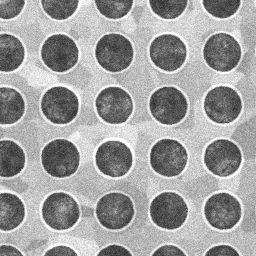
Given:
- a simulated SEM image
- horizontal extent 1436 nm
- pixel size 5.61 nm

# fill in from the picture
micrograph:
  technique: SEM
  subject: a regular array of holes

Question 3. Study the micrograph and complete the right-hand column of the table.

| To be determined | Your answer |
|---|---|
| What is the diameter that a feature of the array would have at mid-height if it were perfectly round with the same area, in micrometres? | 0.222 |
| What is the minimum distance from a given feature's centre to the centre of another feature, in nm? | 295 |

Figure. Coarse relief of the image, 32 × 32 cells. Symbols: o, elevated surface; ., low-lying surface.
...oo.....oo.....oo....oo.....oo
...ooo...ooo....ooo....ooo....oo
ooooooo.oooooooooooooooooooooooo
oooooooooooooooooooooooooooooooo
..oooo...oooo...oooo..oooo...ooo
...oo.....oo.....oo....ooo....oo
...oo.....oo.....oo....oo.....oo
...oo.....oo.....oo....ooo....oo
..oooo...oooo...oooo...ooo...ooo
oooooooooooooooooooooooooooooooo
oooooooooooooooooooooooooooooooo
..oooo...ooo....ooo....ooo....oo
...oo.....oo.....oo....oo.....oo
...oo.....oo.....oo....oo.....oo
...oo.....oo....ooo....ooo....oo
..ooooo.oooooo.ooooo..ooooo..ooo
oooooooooooooooooooooooooooooooo
..ooooo..oooo..ooooo..ooooo..ooo
...oo.....oo....ooo....ooo....oo
...oo.....oo.....oo.....o.....oo
...oo.....oo.....oo....ooo....oo
...ooo...ooo....ooo....ooo....oo
oooooooooooooooooooooooooooooooo
oooooooooooooooooooooooooooooooo
..oooo...oooo...ooo....ooo...ooo
...oo.....oo.....oo....oo.....oo
...oo.....oo.....oo.....o.....oo
...oo.....oo.....oo....ooo....oo
..oooo...oooo..ooooo..ooooo..ooo
oooooooooooooooooooooooooooooooo
oooooooooooooooooooooooooooooooo
...ooo....oo....ooo....ooo....oo